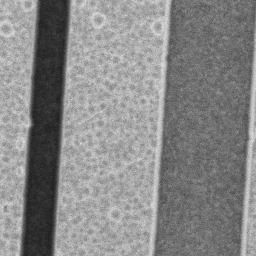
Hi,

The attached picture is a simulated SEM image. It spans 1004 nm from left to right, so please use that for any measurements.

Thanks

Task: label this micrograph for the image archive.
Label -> one or a few lines or trenches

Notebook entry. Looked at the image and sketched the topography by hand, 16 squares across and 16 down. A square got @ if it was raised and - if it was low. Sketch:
@@--@@@@@@@-----
@@--@@@@@@------
@@--@@@@@@------
@@--@@@@@@------
@@--@@@@@@------
@@--@@@@@@------
@@--@@@@@@------
@@--@@@@@@------
@@--@@@@@@------
@@--@@@@@@------
@@--@@@@@@------
@@--@@@@@@-----@
@@--@@@@@@-----@
@--@@@@@@@-----@
@--@@@@@@@-----@
@--@@@@@@@-----@